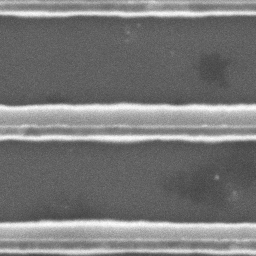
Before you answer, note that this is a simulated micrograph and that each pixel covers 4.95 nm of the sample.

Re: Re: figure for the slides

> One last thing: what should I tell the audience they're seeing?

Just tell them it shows lines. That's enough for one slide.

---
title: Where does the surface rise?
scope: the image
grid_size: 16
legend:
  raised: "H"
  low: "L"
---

HHHHHHHHHHHHHHHH
LLLLLLLLLLLLLLLL
LLLLLLLLLLLLLLLL
LLLLLLLLLLLLLLLL
LLLLLLLLLLLLLLLL
LLLLLLLLLLLLLLLL
LLLLLLLLLLLLLLLL
HHHHHHHHHHHHHHHH
HHHHHHHHHHHHHHHH
LLLLLLLLLLLLLLLL
LLLLLLLLLLLLLLLL
LLLLLLLLLLLLLLLL
LLLLLLLLLLLLLLLL
LLLLLLLLLLLLLLLL
HHHHHHHHHHHHHHHH
HHHHHHHHHHHHHHHH